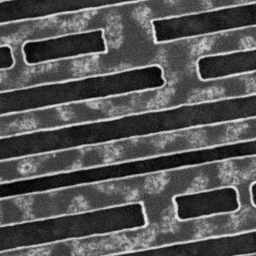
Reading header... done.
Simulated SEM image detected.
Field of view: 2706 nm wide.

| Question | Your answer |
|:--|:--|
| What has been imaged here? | parallel lines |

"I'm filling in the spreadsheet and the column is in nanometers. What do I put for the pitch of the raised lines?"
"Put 465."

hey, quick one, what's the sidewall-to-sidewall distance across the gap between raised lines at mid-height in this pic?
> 233 nanometres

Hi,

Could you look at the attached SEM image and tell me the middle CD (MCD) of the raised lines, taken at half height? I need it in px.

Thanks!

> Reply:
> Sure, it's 22.9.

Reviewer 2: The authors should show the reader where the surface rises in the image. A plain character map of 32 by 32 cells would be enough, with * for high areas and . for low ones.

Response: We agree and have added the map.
...............****************.
........******************......
...*****************............
*******************...........**
********.....******......*******
***..........*******************
.**..........****************...
..*....******************.......
.*****************..*****.......
*************.......*****....***
******..............************
*...............****************
...........*****************....
.....*****************..........
****************................
**********.................*****
****................************
...............*****************
.........*****************......
...*****************...........*
**************...........*******
********...........*************
***..........*******************
........********************.**.
..********************........*.
****************.*****........**
***********.......****.......***
*****.............**************
.................***************
...........*****************....
......****************..........
*****************...............